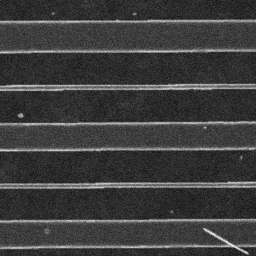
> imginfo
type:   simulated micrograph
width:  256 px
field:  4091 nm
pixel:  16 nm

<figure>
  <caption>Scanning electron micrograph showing lines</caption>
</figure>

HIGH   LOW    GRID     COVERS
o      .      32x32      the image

................................
................................
................................
oooooooooooooooooooooooooooooooo
oooooooooooooooooooooooooooooooo
oooooooooooooooooooooooooooooooo
................................
................................
................................
................................
................................
................................
................................
................................
................................
oooooooooooooooooooooooooooooooo
oooooooooooooooooooooooooooooooo
oooooooooooooooooooooooooooooooo
oooooooooooooooooooooooooooooooo
................................
................................
................................
................................
................................
................................
................................
................................
...........................ooooo
oooooooooooooooooooooooooooooooo
oooooooooooooooooooooooooooooooo
oooooooooooooooooooooooooooooooo
................................